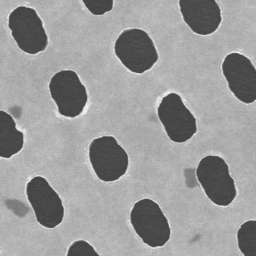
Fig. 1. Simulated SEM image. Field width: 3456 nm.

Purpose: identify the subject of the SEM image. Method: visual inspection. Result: a regular array of holes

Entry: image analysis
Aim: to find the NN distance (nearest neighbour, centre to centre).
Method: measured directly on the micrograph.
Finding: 1020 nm